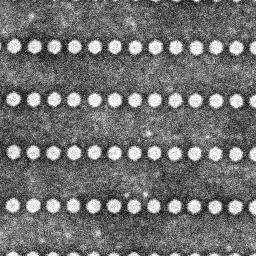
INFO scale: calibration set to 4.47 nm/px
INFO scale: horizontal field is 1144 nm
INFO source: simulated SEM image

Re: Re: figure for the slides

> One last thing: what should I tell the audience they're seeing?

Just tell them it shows a regular array of raised bodies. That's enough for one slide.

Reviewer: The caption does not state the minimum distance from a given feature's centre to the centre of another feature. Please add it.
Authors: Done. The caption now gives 89.3 nanometers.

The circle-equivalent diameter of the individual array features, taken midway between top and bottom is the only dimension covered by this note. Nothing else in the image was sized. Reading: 56.6 nanometres